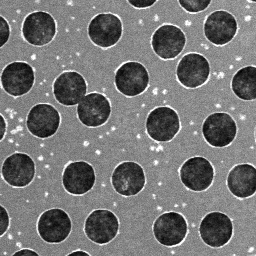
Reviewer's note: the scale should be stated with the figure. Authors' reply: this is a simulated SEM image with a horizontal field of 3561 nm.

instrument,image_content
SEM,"a regular array of holes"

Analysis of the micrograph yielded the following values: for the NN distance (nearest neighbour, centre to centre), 691 nanometers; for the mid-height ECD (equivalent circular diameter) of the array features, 0.472 um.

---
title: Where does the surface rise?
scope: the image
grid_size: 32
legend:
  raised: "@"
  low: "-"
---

@@@@@@@@@@@@@@@@---@@@@---@@@@@@
@@@@@-@@@@@@@@@@@@@@@@@@-@@-@@@@
-@@----@@@@----@@@@@@@@@@@---@@@
-@@----@@@@----@@@@@--@@@@----@@
-@@----@@@@----@@@@----@@@---@@@
-@@@--@@@@@@--@@@@@----@@@@-@@@@
@@@@@@@@@@@@@@@@@@@----@@@@@@@@@
@@@@@@@@@@@@@@@@@@@@@@@---@@@@@@
@---@@@@@@@@@@@---@@@@----@@@@@-
----@@@---@@@@-----@@@----@@@---
----@@@----@@@-----@@@@--@@@@---
@--@@@@----@@@@---@@@@@@@@@@@---
@@@@@@@------@@@@@@@@@@@@@@@@@@@
@@@@---@@@----@@@@@@-@@@@@@@@@@@
@@@----@@@----@@@@@---@@@@---@@@
-@@----@@@@--@@@@@----@@@----@@@
-@@@---@@@@@@@@@@@----@@@-----@@
@@@@@@@@@@@@@@@@@@@@-@@@@@---@@@
@@@@@@@@@@@@@@@@@@@@@@@@@@@@@@@@
@---@@@@@@@@@@@@@@@@@@@@@@@@@@@@
----@@@@@--@@@@--@@@@@@---@@@@@@
----@@@@----@@----@@@@@----@@---
@---@@@@----@@----@@@@@----@----
@@@@@@@@---@@@----@@@@@@--@@@---
@@@@@@@@@@@@@@@@@@@@@@@@@@@@@@-@
@@@@@@@@@@@@@@@@@@@@@@@@@@@@@@@@
-@@@@@--@@@@--@@@@@@@@@@@@@@@@@@
-@@@@----@@----@@@@----@@----@@@
-@@@@----@@----@@@@----@@----@@@
@@@@@---@@@---@@@@@----@@----@@@
@@@@@@@@@@@@@@@@@@@@--@@@@--@@@@
@@--@@@@@--@@@@@@@@@@@@@@@@@@@@@